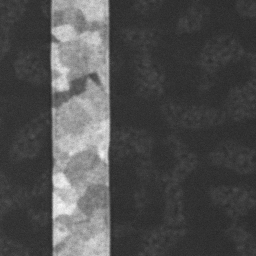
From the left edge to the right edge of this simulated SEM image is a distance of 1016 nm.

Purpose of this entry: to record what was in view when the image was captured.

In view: one or a few lines or trenches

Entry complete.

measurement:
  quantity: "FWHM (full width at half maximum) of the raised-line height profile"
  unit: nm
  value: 218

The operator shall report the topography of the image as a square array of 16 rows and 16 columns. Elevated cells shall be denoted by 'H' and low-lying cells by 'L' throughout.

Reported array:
LLLHHHHLLLLLLLLL
LLLHHHHLLLLLLLLL
LLLHHHHLLLLLLLLL
LLLHHHHLLLLLLLLL
LLLHHHHLLLLLLLLL
LLLHHHHLLLLLLLLL
LLLHHHHLLLLLLLLL
LLLHHHHLLLLLLLLL
LLLHHHHLLLLLLLLL
LLLHHHHLLLLLLLLL
LLLHHHHLLLLLLLLL
LLLHHHHLLLLLLLLL
LLLHHHHLLLLLLLLL
LLLHHHHLLLLLLLLL
LLLHHHHLLLLLLLLL
LLLHHHHLLLLLLLLL